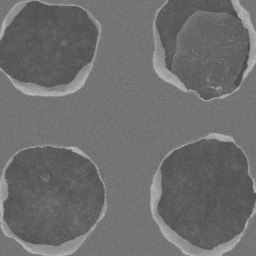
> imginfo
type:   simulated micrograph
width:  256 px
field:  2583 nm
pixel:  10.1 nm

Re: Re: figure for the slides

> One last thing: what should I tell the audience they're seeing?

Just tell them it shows holes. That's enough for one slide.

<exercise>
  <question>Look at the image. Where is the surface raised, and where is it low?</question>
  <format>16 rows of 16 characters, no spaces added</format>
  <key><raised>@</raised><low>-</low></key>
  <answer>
@----@@@@@-----@
------@@@@-----@
------@@@@------
------@@@@------
-----@@@@@@----@
@@--@@@@@@@@---@
@@@@@@@@@@@@@@@@
@@@@@@@@@@@@@@@@
@@@@@@@@@@@@@@@@
@----@@@@@@----@
------@@@@------
------@@@@------
-------@@@------
------@@@@------
------@@@@@----@
@@---@@@@@@---@@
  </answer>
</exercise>